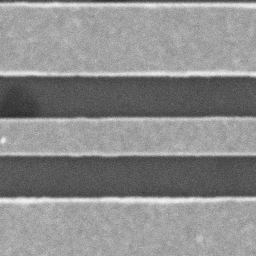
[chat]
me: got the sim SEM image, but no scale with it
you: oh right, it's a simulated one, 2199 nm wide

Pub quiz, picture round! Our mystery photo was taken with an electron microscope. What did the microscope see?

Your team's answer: lines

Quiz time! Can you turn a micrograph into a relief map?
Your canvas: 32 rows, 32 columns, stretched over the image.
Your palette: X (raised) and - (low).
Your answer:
X-X-----------------------------
XXXXXXXXXXXXXXXXXXXXXXXXXXXXXXXX
XXXXXXXXXXXXXXXXXXXXXXXXXXXXXXXX
XXXXXXXXXXXXXXXXXXXXXXXXXXXXXXXX
XXXXXXXXXXXXXXXXXXXXXXXXXXXXXXXX
XXXXXXXXXXXXXXXXXXXXXXXXXXXXXXXX
XXXXXXXXXXXXXXXXXXXXXXXXXXXXXXXX
XXXXXXXXXXXXXXXXXXXXXXXXXXXXXXXX
XXXXXXXXXXXXXXXXXXXXXXXXXXXXXXXX
--------------------------------
--------------------------------
--------------------------------
--------------------------------
--------------------------------
--------------------------------
XXXXXXXXXXXXXXXXXXXXXXXXXXXXXXXX
XXXXXXXXXXXXXXXXXXXXXXXXXXXXXXXX
XXXXXXXXXXXXXXXXXXXXXXXXXXXXXXXX
XXXXXXXXXXXXXXXXXXXXXXXXXXXXXXXX
--------------------------------
--------------------------------
--------------------------------
--------------------------------
--------------------------------
--------------------------------
XXXXXXXXXXXXXXXXXXXXXXXXXXXXXXXX
XXXXXXXXXXXXXXXXXXXXXXXXXXXXXXXX
XXXXXXXXXXXXXXXXXXXXXXXXXXXXXXXX
XXXXXXXXXXXXXXXXXXXXXXXXXXXXXXXX
XXXXXXXXXXXXXXXXXXXXXXXXXXXXXXXX
XXXXXXXXXXXXXXXXXXXXXXXXXXXXXXXX
XXXXXXXXXXXXXXXXXXXXXXXXXXXXXXXX